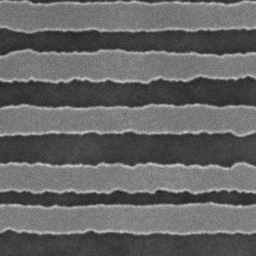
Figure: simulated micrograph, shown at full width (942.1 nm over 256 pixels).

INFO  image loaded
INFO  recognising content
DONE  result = lines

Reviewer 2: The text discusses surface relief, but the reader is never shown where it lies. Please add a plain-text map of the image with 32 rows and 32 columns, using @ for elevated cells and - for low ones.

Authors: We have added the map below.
@@@@@-@@@@@@@@@@@@@@@@@@@@@@-@@@
@@@@@@@@@@@@@@@@@@@@@@@@@@@@@@@@
@@@@@@@@@@@@@@@@@@@@@@@@@@@@@@@@
-@@@@@@@@@@@@@@@@@@@@@@@@@@@@@@@
--------------------------------
--------------------------------
--@@--------@@@@--@@------------
@@@@@@@@@@@@@@@@@@@@@@@@@@@@@@@@
@@@@@@@@@@@@@@@@@@@@@@@@@@@@@@@@
@@@@@@@@@@@@@@@@@@@@@@@@@@@@@@@@
--------------------------------
--------------------------------
--------------------------------
@@@@@@@@@--@@@@@@@@@@@@@@@@@@@@@
@@@@@@@@@@@@@@@@@@@@@@@@@@@@@@@@
@@@@@@@@@@@@@@@@@@@@@@@@@@@@@@@@
@@@@@@@@@@@-@@@@-@@@@@@@@-@@-@@@
--------------------------------
--------------------------------
--------------------------------
-@@@@-------------@-----------@-
@@@@@@@@@@@@@@@@@@@@@@@@@@@@@@@@
@@@@@@@@@@@@@@@@@@@@@@@@@@@@@@@@
@@@@@@@@@@@@@@@@@@@@@@@@@@@@@@@@
--------------------------------
-------------------------@@-----
@@@@@@@@@@@@@@@@@@@@@@@@@@@@@@@@
@@@@@@@@@@@@@@@@@@@@@@@@@@@@@@@@
@@@@@@@@@@@@@@@@@@@@@@@@@@@@@@@@
--------------------------------
--------------------------------
--------------------------------